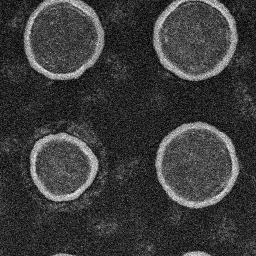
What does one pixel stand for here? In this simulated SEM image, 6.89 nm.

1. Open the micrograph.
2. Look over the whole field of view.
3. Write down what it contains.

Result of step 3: raised bodies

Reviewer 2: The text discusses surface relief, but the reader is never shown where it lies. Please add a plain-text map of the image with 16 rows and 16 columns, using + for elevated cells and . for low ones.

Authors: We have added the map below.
..+++......+++..
..++++....+++++.
..++++....+++++.
..++++....++++..
...++......++...
................
................
................
...........+++..
..++++....+++++.
..++++....+++++.
..+++.....++++..
...........++...
................
................
................